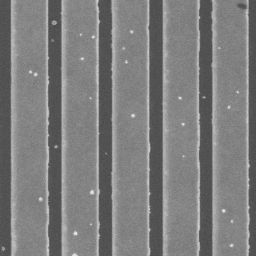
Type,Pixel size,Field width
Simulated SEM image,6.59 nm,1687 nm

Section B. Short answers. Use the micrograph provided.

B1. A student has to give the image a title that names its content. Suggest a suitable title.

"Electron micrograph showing lines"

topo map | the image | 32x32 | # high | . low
..####..####..#####..####..####.
..####..####..#####..####..####.
..####..####..#####..####..####.
..####..####..#####..####..####.
..####..####..#####..####..####.
..####..####..#####..####..####.
..####..####..#####..####..####.
..####..####..#####..####..####.
..####..####..#####..####..####.
..####..####..#####..####..####.
..####..####..#####..####..####.
..####..####..#####..####..####.
..####..####..#####..####..####.
..####..####..#####..####..####.
..####..####..#####..####..####.
..####..####..#####..####..####.
..####..####..#####..####..####.
..####..####..#####..####..####.
..####..####..#####..####..####.
..####..####..#####..####..####.
..####..####..#####..####..####.
..####..####..#####..####..####.
..####..####..#####..####..####.
..####..####..#####..####..####.
..####..####..#####..####..####.
..####..####..#####..####..####.
..####..####..#####..####..####.
..####..####..#####..####..####.
..####..####..#####..####..####.
..####..####..#####..####..####.
..####..####..#####..####..####.
..####..####..#####..####..####.